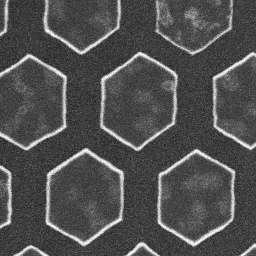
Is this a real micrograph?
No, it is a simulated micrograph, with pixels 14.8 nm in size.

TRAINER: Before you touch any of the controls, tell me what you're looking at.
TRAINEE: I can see raised bodies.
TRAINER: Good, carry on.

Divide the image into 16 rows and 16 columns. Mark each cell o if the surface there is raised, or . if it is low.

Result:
...oooo.........
...oooo.........
....oo..........
................
oooo...oooo...oo
oooo..ooooo..ooo
oooo..ooooo..ooo
oooo..ooooo..ooo
ooo....ooo....oo
................
....ooo....ooo..
o..ooooo..ooooo.
o..ooooo..ooooo.
o..ooooo..ooooo.
....oo.....oo...
................